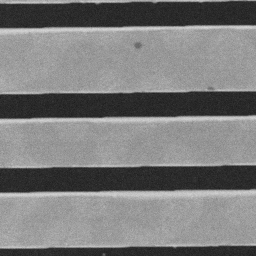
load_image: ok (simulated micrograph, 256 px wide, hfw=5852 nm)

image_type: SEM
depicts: lines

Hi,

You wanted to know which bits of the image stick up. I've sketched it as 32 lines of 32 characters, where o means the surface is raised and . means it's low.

................................
................................
................................
.......ooooooooooooooooooooooooo
oooooooooooooooooooooooooooooooo
oooooooooooooooooooooooooooooooo
oooooooooooooooooooooooooooooooo
oooooooooooooooooooooooooooooooo
oooooooooooooooooooooooooooooooo
oooooooooooooooooooooooooooooooo
oooooooooooooooooooooooooooooooo
ooooooooooooooooo...............
................................
................................
................................
oooooooooooooooooooooooooooooooo
oooooooooooooooooooooooooooooooo
oooooooooooooooooooooooooooooooo
oooooooooooooooooooooooooooooooo
oooooooooooooooooooooooooooooooo
oooooooooooooooooooooooooooooooo
................................
................................
................................
oooooooooooooooooooooooooooooooo
oooooooooooooooooooooooooooooooo
oooooooooooooooooooooooooooooooo
oooooooooooooooooooooooooooooooo
oooooooooooooooooooooooooooooooo
oooooooooooooooooooooooooooooooo
oooooooooooooooooooooooooooooooo
................................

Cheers